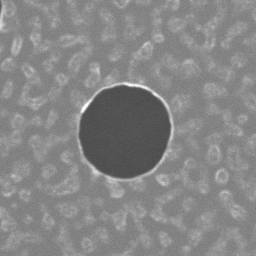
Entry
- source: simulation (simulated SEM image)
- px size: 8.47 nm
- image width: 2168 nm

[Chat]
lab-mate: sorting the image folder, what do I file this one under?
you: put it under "holes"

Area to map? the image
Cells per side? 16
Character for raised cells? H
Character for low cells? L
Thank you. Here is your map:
HHHHHHHHHHHHHHHH
HHHHHHHHHHHHHHHH
HHHHHHHHHHHHHHHH
HHHHHHHHHHHHHHHH
HHHHHHHHHHHHHHHH
HHHHHHHLLHHHHHHH
HHHHHHLLLLHHHHHH
HHHHHLLLLLLHHHHH
HHHHHLLLLLLHHHHH
HHHHHLLLLLHHHHHH
HHHHHHLLLLHHHHHH
HHHHHHHHHHHHHHHH
HHHHHHHHHHHHHHHH
HHHHHHHHHHHHHHHH
HHHHHHHHHHHHHHHH
HHHHHHHHHHHHHHHH